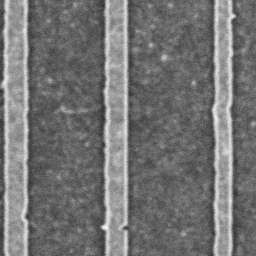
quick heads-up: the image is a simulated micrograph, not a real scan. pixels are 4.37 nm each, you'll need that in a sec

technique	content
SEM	one or a few lines or trenches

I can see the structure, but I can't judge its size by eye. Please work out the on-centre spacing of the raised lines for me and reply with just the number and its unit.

453 nanometers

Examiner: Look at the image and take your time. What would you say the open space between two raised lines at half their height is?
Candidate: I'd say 377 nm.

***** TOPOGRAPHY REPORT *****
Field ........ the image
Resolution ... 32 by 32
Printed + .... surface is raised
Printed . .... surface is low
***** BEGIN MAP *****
.++..........+++...........++...
.++..........+++...........++...
.++..........+++...........++...
.++..........+++...........++...
.++..........+++...........++...
.++..........+++...........++...
.++..........+++...........++...
.++..........+++...........++...
.++..........+++...........++...
.++..........+++...........++...
.++..........+++...........++...
.++..........+++...........++...
.++..........+++...........++...
.++..........+++...........++...
.++..........+++...........++...
.++..........+++...........++...
.++..........+++...........++...
.++..........+++...........++...
.++..........+++...........++...
.++..........+++...........++...
.++..........+++...........++...
.++..........+++...........++...
.++..........+++...........++...
.++..........+++...........++...
.++..........+++...........++...
.++..........+++...........++...
.++..........+++...........++...
.++..........+++...........++...
.++..........++............++...
.++..........+++...........++...
.++..........+++...........++...
.++..........+++...........++...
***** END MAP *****